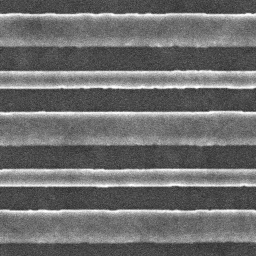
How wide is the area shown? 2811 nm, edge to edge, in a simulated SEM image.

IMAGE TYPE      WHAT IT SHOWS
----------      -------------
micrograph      lines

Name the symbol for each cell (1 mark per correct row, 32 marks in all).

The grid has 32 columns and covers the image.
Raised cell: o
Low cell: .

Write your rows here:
................................
................................
oooooooooooooooooooooooooooooooo
oooooooooooooooooooooooooooooooo
oooooooooooooooooooooooooooooooo
oooooooooooooooooooooo.ooooo..oo
................................
................................
................................
oooooooooooooooooooooooooooooooo
oooooooooooooooooooooooooooooooo
................................
................................
................................
oooooooooooooooooooooooooooooooo
oooooooooooooooooooooooooooooooo
oooooooooooooooooooooooooooooooo
oooooooooooooooooooooooooooooooo
................................
................................
................................
oooooooooooooooooooooooooooooooo
oooooooooooooooooooooooooooooooo
................................
................................
................................
oooooooooooooooooooooooooooooooo
oooooooooooooooooooooooooooooooo
oooooooooooooooooooooooooooooooo
oooooooooooooooooooooooooooooooo
................................
................................